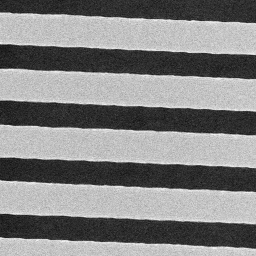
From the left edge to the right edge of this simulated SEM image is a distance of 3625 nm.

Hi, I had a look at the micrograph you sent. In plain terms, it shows lines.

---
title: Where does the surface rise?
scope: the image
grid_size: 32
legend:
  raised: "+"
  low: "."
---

................................
................................
++++++++++++++++++++++..........
++++++++++++++++++++++++++++++++
++++++++++++++++++++++++++++++++
..++++++++++++++++++++++++++++++
.......................+++++++++
................................
................................
+++++++++++++++++++.............
++++++++++++++++++++++++++++++++
++++++++++++++++++++++++++++++++
.+++++++++++++++++++++++++++++++
........................++++++++
................................
................................
++++++++++++++++++++............
++++++++++++++++++++++++++++++++
++++++++++++++++++++++++++++++++
++++++++++++++++++++++++++++++++
.......................+++++++++
................................
................................
++++++++++++++++++..............
++++++++++++++++++++++++++++++++
++++++++++++++++++++++++++++++++
++++++++++++++++++++++++++++++++
......................++++++++++
................................
................................
++++++++++++++++++..............
++++++++++++++++++++++++++++++++